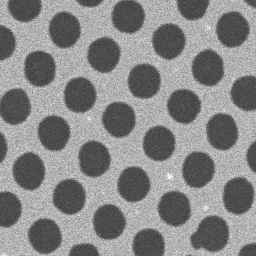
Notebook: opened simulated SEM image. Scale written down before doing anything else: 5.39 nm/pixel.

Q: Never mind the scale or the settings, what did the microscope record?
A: a regular array of holes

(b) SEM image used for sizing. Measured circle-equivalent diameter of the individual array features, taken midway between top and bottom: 35 pixels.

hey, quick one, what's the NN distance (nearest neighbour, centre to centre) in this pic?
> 0.246 microns